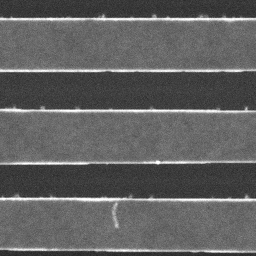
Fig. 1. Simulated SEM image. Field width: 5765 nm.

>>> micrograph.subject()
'lines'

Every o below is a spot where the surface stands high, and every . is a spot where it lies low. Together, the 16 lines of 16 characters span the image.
................
oooooooooooooooo
oooooooooooooooo
oooooooooooooooo
................
................
................
oooooooooooooooo
oooooooooooooooo
oooooooooooooooo
................
................
oooooooooooooooo
oooooooooooooooo
oooooooooooooooo
oooooooooooooooo